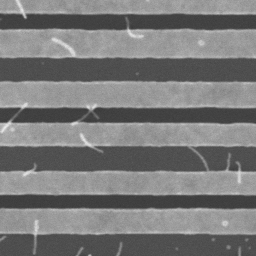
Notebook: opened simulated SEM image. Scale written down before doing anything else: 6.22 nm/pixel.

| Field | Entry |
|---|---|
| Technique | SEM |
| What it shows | lines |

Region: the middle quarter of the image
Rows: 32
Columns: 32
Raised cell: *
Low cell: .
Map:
................................
................................
................................
................................
**........********....*...**....
********************************
********************************
********************************
********************************
********************************
********************************
......*.........................
................................
................................
...*............................
********************************
********************************
********************************
********************************
********************************
......**...............*........
................................
................................
................................
................................
................................
................................
********************************
********************************
********************************
********************************
********************************